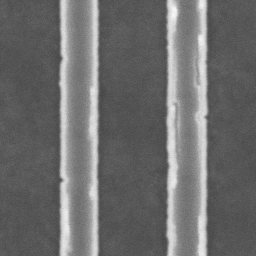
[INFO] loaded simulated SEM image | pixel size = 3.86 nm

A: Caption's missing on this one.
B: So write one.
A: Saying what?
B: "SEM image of one or a few lines or trenches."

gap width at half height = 284 nm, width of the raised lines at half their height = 0.133 um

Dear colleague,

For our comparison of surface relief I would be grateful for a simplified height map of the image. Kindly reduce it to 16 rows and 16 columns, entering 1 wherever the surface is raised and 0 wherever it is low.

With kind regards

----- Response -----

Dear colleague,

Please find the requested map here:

0000110000011000
0000110000011000
0000110000011000
0000110000011000
0000110000011000
0000110000011000
0000110000011000
0000110000011000
0000110000011000
0000110000011000
0000110000011000
0000110000011000
0000110000011000
0000110000011000
0000110000011000
0000110000011000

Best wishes